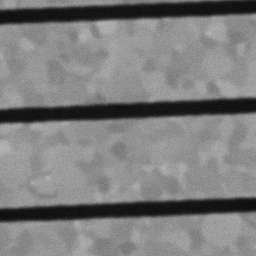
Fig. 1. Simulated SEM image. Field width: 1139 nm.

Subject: lines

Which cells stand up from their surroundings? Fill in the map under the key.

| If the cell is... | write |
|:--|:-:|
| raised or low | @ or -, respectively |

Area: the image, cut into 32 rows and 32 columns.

@@@@@@@@@@@@@@@-----------------
--------------------------------
-----------------@@@@@@@@@@@@@@@
@@@@@@@@@@@@@@@@@@@@@@@@@@@@@@@@
@@@@@@@@@@@@@@@@@@@@@@@@@@@@@@@@
@@@@@@@@@@@@@@@@@@@@@@@@@@@@@@@@
@@@@@@@@@@@@@@@@@@@@@@@@@@@@@@@@
@@@@@@@@@@@@@@@@@@@@@@@@@@@@@@@@
@@@@@@@@@@@@@@@@@@@@@@@@@@@@@@@@
@@@@@@@@@@@@@@@@@@@@@@@@@@@@@@@@
@@@@@@@@@@@@@@@@@@@@@@@@@@@@@@@@
@@@@@@@@@@@@@@@@@@@@@@@@@@@@@@@@
@@@@@@@@@@@@@@@@@@@@@@@---------
@-------------------------------
-------------------------@@@@@@@
@@@@@@@@@@@@@@@@@@@@@@@@@@@@@@@@
@@@@@@@@@@@@@@@@@@@@@@@@@@@@@@@@
@@@@@@@@@@@@@@@@@@@@@@@@@@@@@@@@
@@@@@@@@@@@@@@@@@@@@@@@@@@@@@@@@
@@@@@@@@@@@@@@@@@@@@@@@@@@@@@@@@
@@@@@@@@@@@@@@@@@@@@@@@@@@@@@@@@
@@@@@@@@@@@@@@@@@@@@@@@@@@@@@@@@
@@@@@@@@@@@@@@@@@@@@@@@@@@@@@@@@
@@@@@@@@@@@@@@@@@@@@@@@@@@@@@@@@
@@@@@@@@@@@@@@@@@@@@@@@@@@@@@@@@
@@@@@@@@@@----------------------
--------------------------------
---------@@@@@@@@@@@@@@@@@@@@@@@
@@@@@@@@@@@@@@@@@@@@@@@@@@@@@@@@
@@@@@@@@@@@@@@@@@@@@@@@@@@@@@@@@
@@@@@@@@@@@@@@@@@@@@@@@@@@@@@@@@
@@@@@@@@@@@@@@@@@@@@@@@@@@@@@@@@